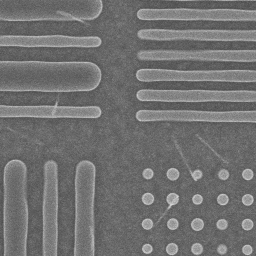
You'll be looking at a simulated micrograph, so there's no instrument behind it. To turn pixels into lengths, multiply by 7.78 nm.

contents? groups of lines, slits or small figures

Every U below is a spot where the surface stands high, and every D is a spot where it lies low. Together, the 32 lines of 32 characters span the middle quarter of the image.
UUUUUUUUDDDDDDDDDDDDDDDDDDDDDDDD
UUUUUUUUUDDDDDDDDDDUUUUUUUDDDDDD
UUUUUUUUUDDDDDDDDDUUUUUUUUUUUUUU
UUUUUUUUUDDDDDDDDDUUUUUUUUUUUUUU
UUUUUUUUUDDDDDDDDDDDDDDDDDDDDDDD
UUUUUUUUDDDDDDDDDDDDDDDDDDDDDDDD
UUUUUUUDDDDDDDDDDDDDDDDDDDDDDDDD
DDDDDDDDDDDDDDDDDDUUUUUUUUUUUUUU
DDDDDDDDDDDDDDDDDDDUUUUUUUUUUUUU
DDDDDDDDDDDDDDDDDDDDDDDDDDDDDDDD
DDDDDDDDDDDDDDDDDDDDDDDDDDDDDDDD
UUUUUUUUUDDDDDDDDDDDDDDDDDDDDDDD
UUUUUUUUUDDDDDDDDDUUUUUUUUUUUUUU
DDDDDDDDDDDDDDDDDDUUUUUUUUUUUUUU
DDDDDDDDDDDDDDDDDDDDDDDDDDDDDDDD
DDDDDDDDDDDDDDDDDDDDDDDDDDDDDDDD
DDDDDDDDDDDDDDDDDDDDDDDDDDDDDDDD
DDDDDDDDDDDDDDDDDDDDDDDDDDDDDDDD
DDDDDDDDDDDDDDDDDDDDDDDDDDDDDDDD
DDDDDDDDDDDDDDDDDDDDDDDDDDDDDDDD
DDDDDDDDDDDDDDDDDDDDDDDDDDDDDDDD
DDDDDDDDDDDDDDDDDDDDDDDDDDDDDDDD
DDDDDDDDDDDDDDDDDDDDDDDDDDDDDDDD
DDDDDDDDDDDDDDDDDDDDDDDDDDDDDDDD
DDDDUUDDDDDDDDDDDDDDDDDDDDDDDDDD
DDDDUUUDDDDDDDDDDDDDDDDDDDDDDDDD
DDDUUUUUDDDDDDDDDDDDUUDDDDUUDDDD
DDDUUUUUDDDDDDDDDDDDUUDDDDUUUDDD
DDDUUUUUDDDDDDDDDDDDDDDDDDUUDDDD
DDDUUUUDDDDDDDDDDDDDDDDDDDDDDDDD
DDDUUUUDDDDDDDDDDDDDDDDDDDDDDDDD
DDDUUUUDDDDDDDDDDDDDDDDDDDDDDDDD